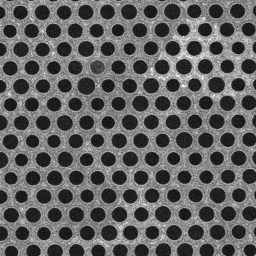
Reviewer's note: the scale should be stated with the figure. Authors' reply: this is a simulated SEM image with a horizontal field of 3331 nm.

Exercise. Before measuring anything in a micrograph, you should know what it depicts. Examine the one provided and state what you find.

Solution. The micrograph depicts a regular array of holes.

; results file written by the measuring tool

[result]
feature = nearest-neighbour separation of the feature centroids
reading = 0.275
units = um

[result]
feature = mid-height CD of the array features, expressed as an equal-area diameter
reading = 0.194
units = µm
